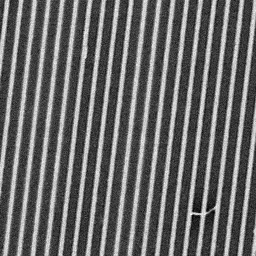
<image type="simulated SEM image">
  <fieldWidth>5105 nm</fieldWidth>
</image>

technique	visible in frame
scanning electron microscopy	parallel lines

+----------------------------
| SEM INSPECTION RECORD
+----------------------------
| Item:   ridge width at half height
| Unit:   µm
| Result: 0.0866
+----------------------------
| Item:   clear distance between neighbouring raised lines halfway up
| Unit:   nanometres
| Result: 188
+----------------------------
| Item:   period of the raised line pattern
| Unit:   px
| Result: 13.7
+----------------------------